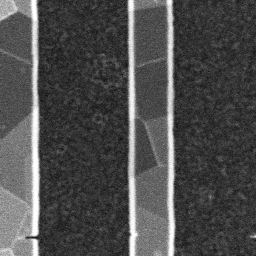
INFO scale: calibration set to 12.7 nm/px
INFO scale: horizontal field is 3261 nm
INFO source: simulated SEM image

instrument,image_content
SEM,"one or a few lines or trenches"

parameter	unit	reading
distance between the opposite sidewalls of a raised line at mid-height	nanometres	495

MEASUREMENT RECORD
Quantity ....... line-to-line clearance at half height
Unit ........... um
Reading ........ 1.23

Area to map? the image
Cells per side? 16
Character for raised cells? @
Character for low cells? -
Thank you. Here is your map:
@@------@@@-----
@@------@@@-----
@@------@@@-----
@@------@@@-----
@@------@@@-----
@@------@@@-----
@@------@@@-----
@@------@@@-----
@@------@@@-----
@@------@@@-----
@@------@@@-----
@@------@@@-----
@@------@@@-----
@@------@@@-----
@@------@@@-----
@@------@@@-----